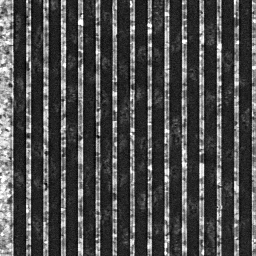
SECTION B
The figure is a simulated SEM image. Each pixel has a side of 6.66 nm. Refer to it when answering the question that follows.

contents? parallel lines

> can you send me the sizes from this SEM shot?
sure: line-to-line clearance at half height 0.0899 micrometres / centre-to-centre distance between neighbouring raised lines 115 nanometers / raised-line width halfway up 25.8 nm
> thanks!